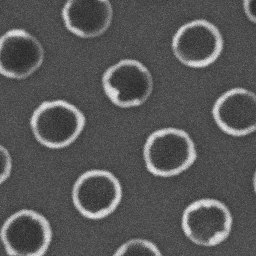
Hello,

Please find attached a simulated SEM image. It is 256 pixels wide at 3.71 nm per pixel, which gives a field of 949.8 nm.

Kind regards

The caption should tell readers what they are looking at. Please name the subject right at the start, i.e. raised bodies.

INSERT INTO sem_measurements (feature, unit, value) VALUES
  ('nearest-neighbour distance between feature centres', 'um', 0.298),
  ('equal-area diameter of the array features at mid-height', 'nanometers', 179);